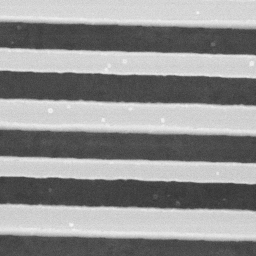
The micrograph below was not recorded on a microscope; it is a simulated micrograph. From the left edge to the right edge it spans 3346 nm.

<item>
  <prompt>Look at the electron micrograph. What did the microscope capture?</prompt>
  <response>lines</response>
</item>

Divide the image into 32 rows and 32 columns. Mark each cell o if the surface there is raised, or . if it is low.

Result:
oooooooooooooooooooooooooooooooo
oooooooooooooooooooooooooooooooo
oooooooooooooooooooooooooooooooo
................................
................................
................................
oooooooooooooooo................
oooooooooooooooooooooooooooooooo
oooooooooooooooooooooooooooooooo
..........................oooooo
................................
................................
ooo.............................
oooooooooooooooooooooooooooooooo
oooooooooooooooooooooooooooooooo
oooooooooooooooooooooooooooooooo
....................oooooooooooo
................................
................................
................................
oooooooooooooooooooooooooooooooo
oooooooooooooooooooooooooooooooo
.................ooooooooooooooo
................................
................................
................................
oooooooooooooooooooooooooooooooo
oooooooooooooooooooooooooooooooo
oooooooooooooooooooooooooooooooo
..........oooooooooooooooooooooo
................................
................................